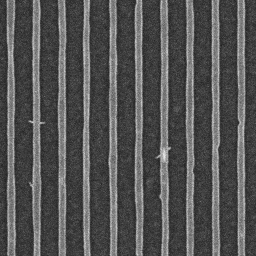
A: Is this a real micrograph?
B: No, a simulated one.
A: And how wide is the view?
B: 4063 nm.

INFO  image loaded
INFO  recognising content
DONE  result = parallel lines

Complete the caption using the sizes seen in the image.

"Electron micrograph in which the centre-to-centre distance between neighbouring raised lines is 406 nanometers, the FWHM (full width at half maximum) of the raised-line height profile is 0.0972 µm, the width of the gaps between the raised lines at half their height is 306 nanometers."